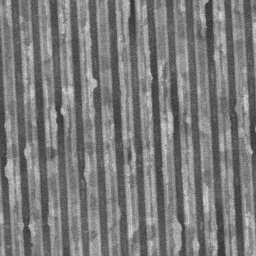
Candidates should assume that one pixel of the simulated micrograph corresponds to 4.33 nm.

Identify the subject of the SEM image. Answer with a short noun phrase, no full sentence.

parallel lines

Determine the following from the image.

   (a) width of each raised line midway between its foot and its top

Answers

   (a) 42.7 nm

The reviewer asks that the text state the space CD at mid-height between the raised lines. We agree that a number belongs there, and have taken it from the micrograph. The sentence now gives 42.4 nm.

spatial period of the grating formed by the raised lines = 0.0837 microns